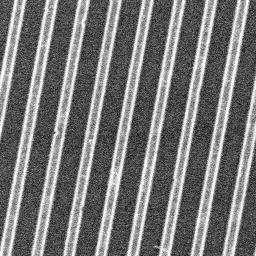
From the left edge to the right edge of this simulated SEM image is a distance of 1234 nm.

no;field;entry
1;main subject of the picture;parallel lines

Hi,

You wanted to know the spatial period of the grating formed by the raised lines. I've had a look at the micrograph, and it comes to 151 nanometres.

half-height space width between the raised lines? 0.108 micrometres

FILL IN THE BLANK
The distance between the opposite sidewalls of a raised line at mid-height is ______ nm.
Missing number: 40.3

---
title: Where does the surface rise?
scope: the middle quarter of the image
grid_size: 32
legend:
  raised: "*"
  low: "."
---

.**......**......**......**.....
.**......**......**......**.....
***......**......**.....***.....
***.....**......**......**......
**......**......**......**......
**......**......**......**......
**......**......**......**......
**......**......**......**......
**.....**......**......***.....*
*......**......**......**......*
*......**......**......**......*
*......**......**......**......*
*......**......**......**......*
*......**......**.....***.....**
......**......**......**......**
......**......**......**......**
......**......**......**......**
......**......**......**......**
......**......**.....***......**
.....**......**......***.....**.
.....**......**......**......**.
.....**......**......**......**.
.....**......**......**......**.
.....**......**......**......**.
....**......***.....***.....**..
....**......**......**......**..
....**......**......**......**..
....**......**......**......**..
....**......**......**......**..
....**......**.....***......**..
...**......**......**.......*...
...**......**......**......**...